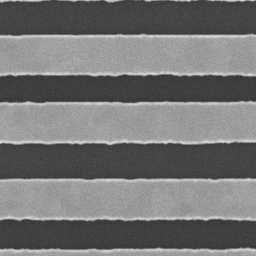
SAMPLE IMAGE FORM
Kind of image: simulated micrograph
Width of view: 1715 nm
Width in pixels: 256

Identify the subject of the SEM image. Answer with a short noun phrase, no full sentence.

lines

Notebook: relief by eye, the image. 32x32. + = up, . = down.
................................
................................
................................
................................
++++++++++++++++++++++++++++++++
++++++++++++++++++++++++++++++++
++++++++++++++++++++++++++++++++
++++++++++++++++++++++++++++++++
++++++++++++++++++++++++++++++++
................................
................................
................................
................................
++++++++++++++++++++++++++++++++
++++++++++++++++++++++++++++++++
++++++++++++++++++++++++++++++++
++++++++++++++++++++++++++++++++
++++++++++++++++++++++++++++++++
................................
................................
................................
................................
.+++++++++++++++++++++++++++++++
++++++++++++++++++++++++++++++++
++++++++++++++++++++++++++++++++
++++++++++++++++++++++++++++++++
++++++++++++++++++++++++++++++++
..........++...++.+..........+++
................................
................................
................................
++++++++++++++++++++++++++++++++